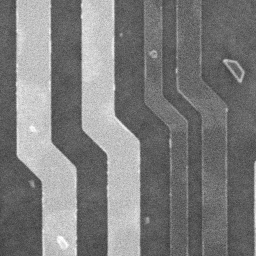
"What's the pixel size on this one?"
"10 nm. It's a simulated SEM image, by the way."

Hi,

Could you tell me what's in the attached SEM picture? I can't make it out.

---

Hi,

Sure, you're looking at groups of lines, slits or small figures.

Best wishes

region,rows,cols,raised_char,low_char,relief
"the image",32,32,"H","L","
LLHHHHLLLLHHHHLLLLHHLLHHHLLLLLLL
LLHHHHLLLLHHHHLLLLHHLLHHHLLLLLLL
LLHHHHLLLLHHHHLLLLHHLLHHHLLLLLLL
LLHHHHLLLLHHHHLLLLHHLLHHHLLLLLLL
LLHHHHLLLLHHHHLLLLHHLLHHHLLLLLLL
LLHHHHLLLLHHHHLLLLHHLLHHHLLLLLLL
LLHHHHLLLLHHHHLLLLHHLLHHHLLLLLLL
LLHHHHLLLLHHHHLLLLHHLLHHHLLLHLLL
LLHHHHLLLLHHHHLLLLHHLLHHHLLLLHLL
LLHHHHLLLLHHHHLLLLHHLLHHHLLLLHLL
LLHHHHLLLLHHHHLLLLHHLLHHHHLLLLLL
LLHHHHLLLLHHHHLLLLHHLLLHHHHLLLLL
LLHHHHLLLLHHHHLLLLHHHLLLHHHHLLLL
LLHHHHLLLLHHHHLLLLLHHHLLHHHHLLLL
LLHHHHLLLLHHHHLLLLLLHHHLLHHHLLLL
LLHHHHLLLLHHHHHLLLLLLHHLLHHHLLLL
LLHHHHLLLLLHHHHHLLLLLHHLLHHHLLLL
LLHHHHLLLLLLHHHHHLLLLHHLLHHHLLLL
LLHHHHHLLLLLLHHHHLLLLHHLLHHHLLLL
LLHHHHHHLLLLLHHHHLLLLHHLLHHHLLLL
LLLHHHHHHLLLLLHHHLLLLHHLLHHHLLLL
LLLLHHHHHLLLLLHHHLLLLHHLLHHHLLLL
LLLLLHHHHLLLLLHHHLLLLHHLLHHHLLLL
LLLLLHHHHLLLLLHHHLLLLHHLLHHHLLLL
LLLLLHHHHLLLLLHHHLLLLHHLLHHHLLLL
LLLLLHHHHLLLLLHHHLLLLHHLLHHHLLLL
LLLLLHHHHLLLLLHHHLLLLHHLLHHHLLLL
LLLLLHHHHLLLLLHHHLLLLHHLLHHHLLLL
LLLLLHHHHLLLLLHHHLLLLHHLLHHHLLLL
LLLLLHHHHLLLLLHHHLLLLHHLLHHHLLLL
LLLLLHHHHLLLLLHHHLLLLHHLLHHHLLLL
LLLLLHHHHLLLLLHHHLLLLHHLLHHHLLLL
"